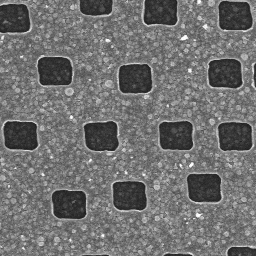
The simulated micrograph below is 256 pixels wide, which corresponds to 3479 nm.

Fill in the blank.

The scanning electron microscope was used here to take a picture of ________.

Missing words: a regular array of holes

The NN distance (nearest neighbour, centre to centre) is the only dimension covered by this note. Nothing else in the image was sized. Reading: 847 nm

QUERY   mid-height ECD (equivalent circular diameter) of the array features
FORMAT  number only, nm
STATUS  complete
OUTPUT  465